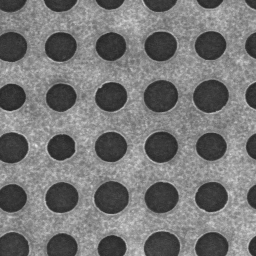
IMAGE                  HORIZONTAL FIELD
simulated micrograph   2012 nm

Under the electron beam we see a regular array of holes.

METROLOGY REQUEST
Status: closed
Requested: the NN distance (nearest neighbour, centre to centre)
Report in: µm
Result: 0.391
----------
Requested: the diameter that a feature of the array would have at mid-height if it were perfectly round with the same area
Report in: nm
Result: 249